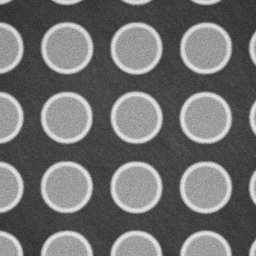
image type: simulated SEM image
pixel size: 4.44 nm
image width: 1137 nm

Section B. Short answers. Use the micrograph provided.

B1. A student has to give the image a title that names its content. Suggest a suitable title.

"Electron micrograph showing an array of small figures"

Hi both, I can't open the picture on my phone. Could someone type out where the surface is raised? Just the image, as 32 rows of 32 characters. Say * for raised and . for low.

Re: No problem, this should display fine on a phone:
........*.......**.......**.....
................................
................................
**....****.....****.....****....
***...*****...******...******...
***..*******..******...******..*
***..*******..******...******..*
***...*****...******...******...
**....****.....****.....****....
................................
................................
................**..............
**....*****....****....*****....
***..******...******...******..*
***..******...******..*******..*
***..******...******...******..*
**....*****....*****...*****....
*......***......***.....***.....
................................
................................
*......***......**......***.....
**....*****....*****...*****....
***..******...******...******..*
***..*******..******..*******..*
***..******...******...******..*
**....*****....*****...*****....
*......**.......**.......**.....
................................
................................
**....****.....****.....****....
**....*****...******...*****....
***..*******..******...******..*